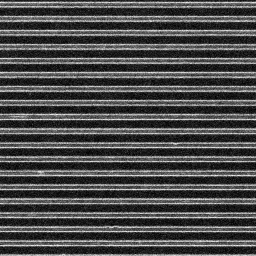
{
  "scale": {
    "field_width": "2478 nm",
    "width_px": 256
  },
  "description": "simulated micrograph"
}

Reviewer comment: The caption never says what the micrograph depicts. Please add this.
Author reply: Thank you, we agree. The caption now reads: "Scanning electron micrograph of parallel lines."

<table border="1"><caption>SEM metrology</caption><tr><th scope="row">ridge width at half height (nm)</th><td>102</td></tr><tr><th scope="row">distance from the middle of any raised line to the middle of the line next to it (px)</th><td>14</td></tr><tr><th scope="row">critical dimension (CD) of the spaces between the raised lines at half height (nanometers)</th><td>31.4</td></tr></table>